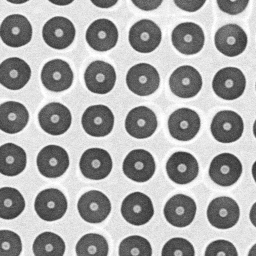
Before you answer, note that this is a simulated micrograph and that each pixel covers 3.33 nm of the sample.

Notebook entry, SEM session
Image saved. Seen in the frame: an array of small figures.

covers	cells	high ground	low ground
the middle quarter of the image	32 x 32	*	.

..***.......*****.....*******...
..***........***.......*****....
...*.........***........***.....
...*.........**.........**......
...**........**.........**......
..***........***........**......
.*****......****........**......
********..********.....***......
****************************....
********************************
******.....********...**********
.****.......*****......****.....
..***.......****........**......
..**.........**.........**......
..**.........**.........*.......
..***.......***.........*.......
.****.......***........**.......
******.....*****......****......
********.*********...*****......
****************************...*
********************************
******....*******...********..**
.***.......*****......****......
.***........***........***......
.***........***........**.......
.**.........**.........**.......
.***........***........**.......
****.......****........**.......
*****.....******......****......
******************..*******.....
****************************...*
*****...************************